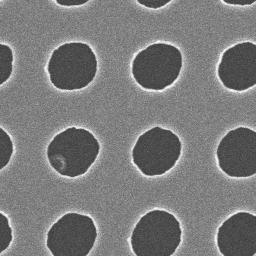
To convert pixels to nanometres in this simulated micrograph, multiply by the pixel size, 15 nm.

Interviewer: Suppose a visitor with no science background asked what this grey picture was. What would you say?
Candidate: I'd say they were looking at holes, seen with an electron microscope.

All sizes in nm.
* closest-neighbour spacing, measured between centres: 1270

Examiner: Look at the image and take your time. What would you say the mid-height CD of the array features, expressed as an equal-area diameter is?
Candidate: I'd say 730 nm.